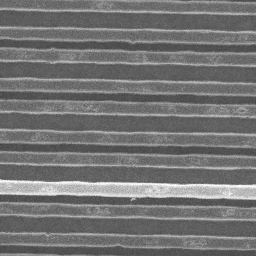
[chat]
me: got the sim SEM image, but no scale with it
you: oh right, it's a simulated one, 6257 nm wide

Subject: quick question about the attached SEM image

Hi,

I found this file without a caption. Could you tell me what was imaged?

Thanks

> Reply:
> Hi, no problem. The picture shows parallel lines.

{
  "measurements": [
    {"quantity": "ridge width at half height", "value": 296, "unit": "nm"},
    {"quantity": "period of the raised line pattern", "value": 633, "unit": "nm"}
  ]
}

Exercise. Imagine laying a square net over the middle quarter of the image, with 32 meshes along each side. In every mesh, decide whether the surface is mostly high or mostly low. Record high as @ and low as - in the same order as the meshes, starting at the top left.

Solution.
--------------------------------
--------------------------------
--------------------------------
--------------------------------
@@@@@@@@@@@@@@@@@@---@@@@-------
@@@@@@@@@@@@@@@@@@@@@@@@@@@@@@@@
@@@@@@@@@@@@@@@@@@@@@@@@@@@@@@@@
--------------------------------
--------------------------------
@@----@@@-@@--------------------
@@@@@@@@@@@@@@@@@@@@@@@@@@@@@@@@
@@@@@@@@@@@@@@@@@@@@@@@@@@@@@@@@
----------------@@@@@@@@@@@@@@@@
--------------------------------
--------------------------------
--------------------------------
--------------------------------
@@@@@@@@@@@@@@@@@@@@@@@@@@@@@@--
@@@@@@@@@@@@@@@@@@@@@@@@@@@@@@@@
@@@@@@@@@@@@@@@@@@@@@@@@@@@@@@@@
--------------------------------
--------------------------------
@@@@@@@@@@----------------------
@@@@@@@@@@@@@@@@@@@@@@@@@@@@@@@@
@@@@@@@@@@@@@@@@@@@@@@@@@@@@@@@@
--------------------@@@@@@@@@@@@
--------------------------------
--------------------------------
--------------------------------
--------------------------------
@@@@@@@@@@@@@@@@@@@@@@@@@@@@@@@-
@@@@@@@@@@@@@@@@@@@@@@@@@@@@@@@@